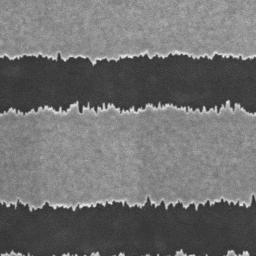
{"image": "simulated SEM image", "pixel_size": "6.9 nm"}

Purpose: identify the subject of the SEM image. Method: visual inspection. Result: one or a few lines or trenches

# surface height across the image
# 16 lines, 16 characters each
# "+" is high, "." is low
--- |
++++++++++++++++
++++++++++++++++
++++++++++++++++
++.++++++...++++
................
................
................
++++++++++++++++
++++++++++++++++
++++++++++++++++
++++++++++++++++
++++++++++++++++
++++++++++++++++
................
................
................